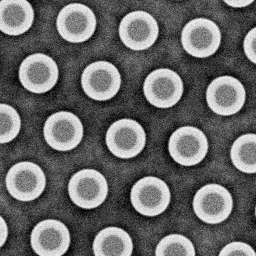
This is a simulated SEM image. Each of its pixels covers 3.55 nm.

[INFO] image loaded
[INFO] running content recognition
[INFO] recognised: an array of small figures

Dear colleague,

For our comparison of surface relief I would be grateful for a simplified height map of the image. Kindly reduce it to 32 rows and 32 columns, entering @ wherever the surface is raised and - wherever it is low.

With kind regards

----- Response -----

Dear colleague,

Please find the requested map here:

@@@@-----@-------------------@@-
@@@@----@@@@-----@--------------
@@@@---@@@@@---@@@@-----@@------
@@@@---@@@@@---@@@@@---@@@@-----
--------@@@----@@@@@---@@@@@---@
----------------@@@----@@@@----@
-----------------------@@@@----@
---@@@@------------------------@
--@@@@@----@@@------------------
--@@@@@---@@@@@----@@@----------
---@@@@---@@@@@---@@@@@---@@@@--
----@------@@@@---@@@@@---@@@@@-
------------@------@@@----@@@@@-
@@------------------------@@@@--
@@----@@@-----------------------
@@----@@@@----@@@---------------
@@----@@@@---@@@@@----@@@-------
@-----@@@@---@@@@@---@@@@@----@@
-------@@-----@@@@---@@@@@---@@@
---------------@@----@@@@@---@@@
--@@-------------------@-----@@@
-@@@@-----@@-------------------@
-@@@@@---@@@@-----@@------------
-@@@@----@@@@----@@@@----@@@----
--@@@----@@@@---@@@@@---@@@@@---
----------@@@----@@@@---@@@@@---
-----------------@@@----@@@@@---
-------------------------@@@----
@---@@@@------@-----------------
@---@@@@@---@@@@-----@@---------
----@@@@@---@@@@----@@@@-----@@-
----@@@@----@@@@----@@@@----@@@@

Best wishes